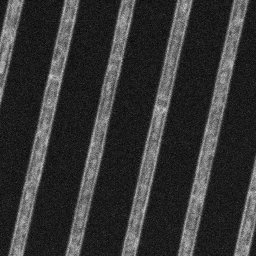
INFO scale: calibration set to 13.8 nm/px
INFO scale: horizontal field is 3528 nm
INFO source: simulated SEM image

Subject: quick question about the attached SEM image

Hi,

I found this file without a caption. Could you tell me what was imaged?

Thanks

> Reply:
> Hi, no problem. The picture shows parallel lines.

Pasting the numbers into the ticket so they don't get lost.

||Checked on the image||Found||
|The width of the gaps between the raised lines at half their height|11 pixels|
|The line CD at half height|607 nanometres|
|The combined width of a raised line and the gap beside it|756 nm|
